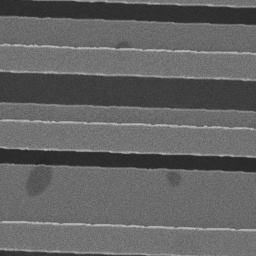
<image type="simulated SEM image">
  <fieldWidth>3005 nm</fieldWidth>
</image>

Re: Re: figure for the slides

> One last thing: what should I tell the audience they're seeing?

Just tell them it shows lines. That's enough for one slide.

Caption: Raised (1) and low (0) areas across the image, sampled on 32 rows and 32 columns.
00000000000000000000011111111111
00000000000000000000000000000000
11111111111110000000000000000000
11111111111111111111111111111111
11111111111111111111111111111111
11111111111111111111111111111111
11111111111111111111111111111111
11111111111111111111111111111111
11111111111111111111111111111111
00000000000000001111111111111111
00000000000000000000000000000000
00000000000000000000000000000000
00000000000000000000000000000000
11111111111111111110000000000000
11111111111111111111111111111111
11111111111111111111111111111111
11111111111111111111111111111111
11111111111111111111111111111111
11111111111111111111111111111111
00000000000000000000000000011111
00000000000000000000000000000000
11111111111111111111111111111110
11111111111111111111111111111111
11111111111111111111111111111111
11111111111111111111111111111111
11111111111111111111111111111111
11111111111111111111111111111111
11111111111111111111111111111111
11111111111111111111111111111111
11111111111111111111111111111111
11111111111111111111111111111111
00000111111111111111111111111111